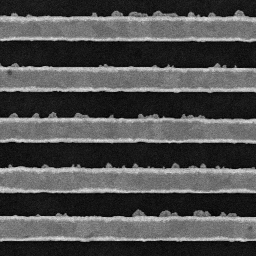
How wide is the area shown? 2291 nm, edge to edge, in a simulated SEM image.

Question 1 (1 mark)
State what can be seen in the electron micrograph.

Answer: lines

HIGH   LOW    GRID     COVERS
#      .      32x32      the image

................................
................................
################################
################################
################################
................................
................................
................................
######################....##....
################################
################################
................................
................................
................................
................................
################################
################################
################################
................................
................................
................................
################################
################################
################################
................................
................................
................................
################################
################################
################################
................................
................................